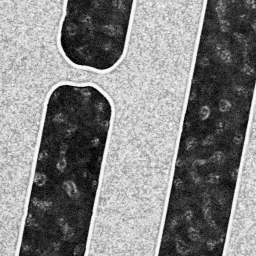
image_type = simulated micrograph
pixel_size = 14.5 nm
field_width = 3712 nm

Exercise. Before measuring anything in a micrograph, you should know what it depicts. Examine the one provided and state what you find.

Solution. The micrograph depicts one or a few lines or trenches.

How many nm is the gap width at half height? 966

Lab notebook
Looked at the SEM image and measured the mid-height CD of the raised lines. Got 69.6 pixels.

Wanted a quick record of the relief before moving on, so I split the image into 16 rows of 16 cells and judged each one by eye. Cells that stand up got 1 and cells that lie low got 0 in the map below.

1111000011111000
1111000011111000
1111000011110000
1111000011110000
1111111111110000
1110001111110000
1110000111110000
1110000111100000
1100000111100001
1100000111100001
1100001111100001
1100001111100001
1100001111000001
1100001111000001
1000001111000011
1000011111000011